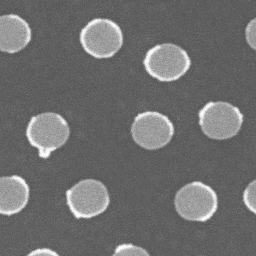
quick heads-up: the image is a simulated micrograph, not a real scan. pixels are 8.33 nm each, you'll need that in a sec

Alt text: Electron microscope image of raised bodies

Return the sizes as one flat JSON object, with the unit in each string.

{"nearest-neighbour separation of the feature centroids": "581 nm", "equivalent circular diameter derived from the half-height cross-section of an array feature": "334 nanometers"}